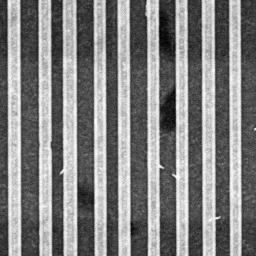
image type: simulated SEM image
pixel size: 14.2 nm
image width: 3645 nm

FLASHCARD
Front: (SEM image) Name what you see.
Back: parallel lines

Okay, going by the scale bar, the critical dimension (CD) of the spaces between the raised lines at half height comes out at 268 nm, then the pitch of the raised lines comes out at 393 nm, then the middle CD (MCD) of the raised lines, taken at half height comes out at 0.134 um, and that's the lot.